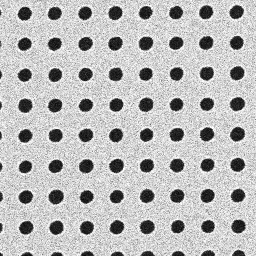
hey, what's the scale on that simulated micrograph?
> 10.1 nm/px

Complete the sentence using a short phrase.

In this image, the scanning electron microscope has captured a regular array of holes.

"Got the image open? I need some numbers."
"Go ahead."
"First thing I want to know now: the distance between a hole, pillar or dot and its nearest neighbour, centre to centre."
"305 nm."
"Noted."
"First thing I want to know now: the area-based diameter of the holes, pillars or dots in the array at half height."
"146 nm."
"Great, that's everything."